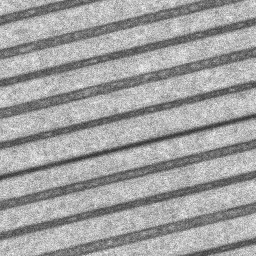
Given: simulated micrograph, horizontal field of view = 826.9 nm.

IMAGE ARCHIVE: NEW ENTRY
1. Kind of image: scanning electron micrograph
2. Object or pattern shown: parallel lines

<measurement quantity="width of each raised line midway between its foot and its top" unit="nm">60.4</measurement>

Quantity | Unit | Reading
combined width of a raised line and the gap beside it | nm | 96.4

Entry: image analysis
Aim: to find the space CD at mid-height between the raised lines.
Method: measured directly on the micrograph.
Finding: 32.9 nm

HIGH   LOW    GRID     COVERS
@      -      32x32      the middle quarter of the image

--------@@@@@@@@@@@@@@@@@@------
---@@@@@@@@@@@@@@@@@@@----------
@@@@@@@@@@@@@@@@@@--------------
@@@@@@@@@@@@@@---------------@@@
@@@@@@@@@@--------------@@@@@@@@
@@@@@@--------------@@@@@@@@@@@@
@---------------@@@@@@@@@@@@@@@@
------------@@@@@@@@@@@@@@@@@@@@
--------@@@@@@@@@@@@@@@@@@@@----
----@@@@@@@@@@@@@@@@@@@@--------
@@@@@@@@@@@@@@@@@@@@----------@@
@@@@@@@@@@@@@@@@----------@@@@@@
@@@@@@@@@@@@----------@@@@@@@@@@
@@@@@@@@----------@@@@@@@@@@@@@@
@@@@----------@@@@@@@@@@@@@@@@@@
----------@@@@@@@@@@@@@@@@@@@@@@
------@@@@@@@@@@@@@@@@@@@@@@@---
--@@@@@@@@@@@@@@@@@@@@@@@-------
@@@@@@@@@@@@@@@@@@@@@--------@@@
@@@@@@@@@@@@@@@@@--------@@@@@@@
@@@@@@@@@@@@@-------@@@@@@@@@@@@
@@@@@@@@@-------@@@@@@@@@@@@@@@@
@@@@@-------@@@@@@@@@@@@@@@@@@@-
@-------@@@@@@@@@@@@@@@@@@@-----
----@@@@@@@@@@@@@@@@@@@---------
@@@@@@@@@@@@@@@@@@--------------
@@@@@@@@@@@@@@--------------@@@@
@@@@@@@@@@--------------@@@@@@@@
@@@@@@--------------@@@@@@@@@@@@
@@--------------@@@@@@@@@@@@@@@@
-----------@@@@@@@@@@@@@@@@@@@--
-------@@@@@@@@@@@@@@@@@@@------